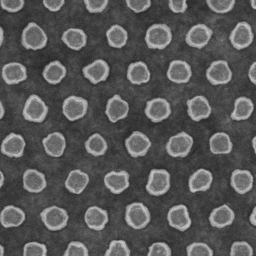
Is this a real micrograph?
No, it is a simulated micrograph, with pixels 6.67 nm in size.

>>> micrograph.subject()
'a regular array of raised bodies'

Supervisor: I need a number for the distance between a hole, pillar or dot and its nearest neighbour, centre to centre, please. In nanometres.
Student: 269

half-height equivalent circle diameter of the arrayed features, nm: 148